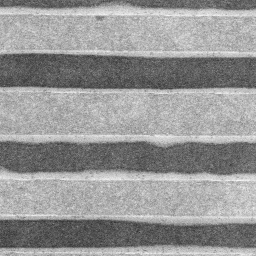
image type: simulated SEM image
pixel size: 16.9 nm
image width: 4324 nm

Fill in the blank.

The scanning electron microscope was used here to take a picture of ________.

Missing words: lines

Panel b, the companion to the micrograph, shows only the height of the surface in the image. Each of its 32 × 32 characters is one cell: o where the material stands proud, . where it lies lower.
................................
................................
oooooooooooooooooooooooooooooooo
oooooooooooooooooooooooooooooooo
oooooooooooooooooooooooooooooooo
oooooooooooooooooooooooooooooooo
.............ooooooooooooooooooo
................................
................................
................................
................................
ooooooo.........................
oooooooooooooooooooooooooooooooo
oooooooooooooooooooooooooooooooo
oooooooooooooooooooooooooooooooo
oooooooooooooooooooooooooooooooo
oooooooooooooooooooooooooooooooo
................................
................................
................................
................................
................................
ooooooooooooooooooooooooooo.oooo
oooooooooooooooooooooooooooooooo
oooooooooooooooooooooooooooooooo
oooooooooooooooooooooooooooooooo
oooooooooooooooooooooooooooooooo
................................
................................
................................
................................
ooo.............................